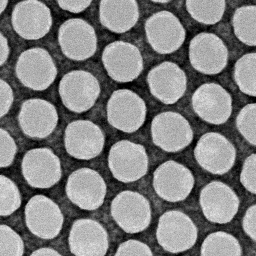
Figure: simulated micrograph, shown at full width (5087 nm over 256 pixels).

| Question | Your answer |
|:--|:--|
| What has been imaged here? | a regular array of raised bodies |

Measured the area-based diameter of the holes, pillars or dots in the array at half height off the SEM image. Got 804 nm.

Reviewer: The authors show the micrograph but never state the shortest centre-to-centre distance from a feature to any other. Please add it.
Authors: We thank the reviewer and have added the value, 977 nm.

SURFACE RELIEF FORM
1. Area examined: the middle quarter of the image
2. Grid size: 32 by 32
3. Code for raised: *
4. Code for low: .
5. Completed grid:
..........**********....****....
...........********...*******...
.******....********..*********..
********....******...*********..
********.............*********..
*********............*********..
*********.....**......********..
*********...******....********..
********....*******....******...
********...*********.....***....
*******....*********............
..****.....*********............
...........*********....*****...
...........*********...*******..
..*****....*********..*********.
.*******....*******...*********.
*********.....****....**********
**********............**********
**********............**********
**********....***.....**********
**********..*******.....*******.
.********..*********.....****...
.********..*********............
...****....**********...........
...........**********.....**....
...........**********...******..
...****.....*********..********.
..*******...********...*********
.*********...******....*********
.*********.....*......**********
.*********............**********
**********.............*********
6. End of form